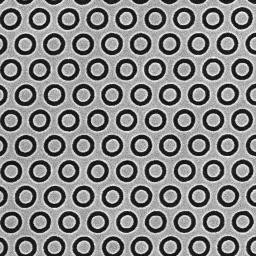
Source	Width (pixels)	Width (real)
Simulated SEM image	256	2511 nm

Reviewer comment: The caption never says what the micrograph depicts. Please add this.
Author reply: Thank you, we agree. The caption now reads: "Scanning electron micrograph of a regular array of ring-shaped grooves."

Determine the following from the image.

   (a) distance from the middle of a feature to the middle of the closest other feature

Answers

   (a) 282 nanometers